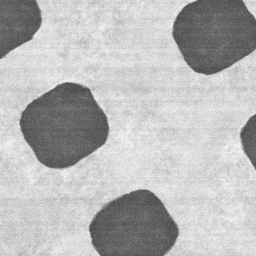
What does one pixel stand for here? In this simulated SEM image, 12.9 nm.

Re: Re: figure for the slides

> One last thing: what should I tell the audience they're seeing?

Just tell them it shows holes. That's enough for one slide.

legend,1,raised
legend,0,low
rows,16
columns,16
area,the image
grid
0011111111110001
0001111111100000
0011111111100000
1111111111100001
1111111111110011
1110011111111111
1100001111111111
1000000111111111
1000000111111110
1100001111111110
1110111111111111
1111111111111111
1111111000111111
1111110000011111
1111110000011111
1111110000011111